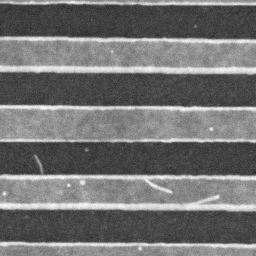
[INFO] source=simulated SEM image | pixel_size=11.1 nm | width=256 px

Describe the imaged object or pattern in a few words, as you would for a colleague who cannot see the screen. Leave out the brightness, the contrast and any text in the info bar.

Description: lines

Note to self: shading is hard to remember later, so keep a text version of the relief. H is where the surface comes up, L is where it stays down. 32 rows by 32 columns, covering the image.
LLLLLLLLLLLLLLLHHHHHHHHHHHHHHHHH
LLLLLLLLLLLLLLLLLLLLLLLLLLLLLLLL
LLLLLLLLLLLLLLLLLLLLLLLLLLLLLLLL
LLLLLLLLLLLLLLLLLLLLLLLLLLLLLLLL
LLLLLLLLLLLLLLLLLLLLLLLLLLLLLLLL
HHHHHHHHHHHHHHHHHHHHHHHHHHHHHHHH
HHHHHHHHHHHHHHHHHHHHHHHHHHHHHHHH
HHHHHHHHHHHHHHHHHHHHHHHHHHHHHHHH
HHHHHHHHHHHHHHHHHHHHHHHHHHHHHHHH
LLLLLLLLLLLLLLLLLLLLLLLLLLLLLLLL
LLLLLLLLLLLLLLLLLLLLLLLLLLLLLLLL
LLLLLLLLLLLLLLLLLLLLLLLLLLLLLLLL
LLLLLLLLLLLLLLLLLLLLLLLLLLLLLLLL
HHHHHHHHHHHHHHHHHHHHHHHHHHHHHHHH
HHHHHHHHHHHHHHHHHHHHHHHHHHHHHHHH
HHHHHHHHHHHHHHHHHHHHHHHHHHHHHHHH
HHHHHHHHHHHHHHHHHHHHHHHHHHHHHHHH
HHHHHHHHHHHHHHHHHHHHHHHHHHHHHHHH
LLLLLLLLLLLLLLLLLLLLLLLLLLLLLLLL
LLLLLLLLLLLLLLLLLLLLLLLLLLLLLLLL
LLLLLLLLLLLLLLLLLLLLLLLLLLLLLLLL
LLLLLLLLLLLLLLLLLLLLLLLLLLLLLLLL
HHHHHHHHHHHHHHHHHHHHHHHHHHHHHHHH
HHHHHHHHHHHHHHHHHHHHHHHHHHHHHHHH
HHHHHHHHHHHHHHHHHHHHHHHHHHHHHHHH
HHHHHHHHHHHHHHHHHHHHHHHHHHHHHHHH
LLLLLLLLLLLLLLLLLLLLLLLLLLLLLLLL
LLLLLLLLLLLLLLLLLLLLLLLLLLLLLLLL
LLLLLLLLLLLLLLLLLLLLLLLLLLLLLLLL
LLLLLLLLLLLLLLLLLLLLLLLLLLLLLLLL
HHHHHHHHHHHHHHHHHHHLHLLLLLLLLLLL
HHHHHHHHHHHHHHHHHHHHHHHHHHHHHHHH